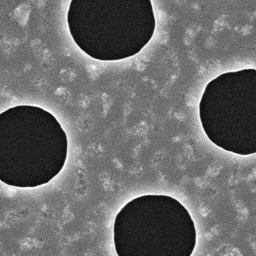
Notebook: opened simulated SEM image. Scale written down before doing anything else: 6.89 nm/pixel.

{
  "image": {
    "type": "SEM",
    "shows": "holes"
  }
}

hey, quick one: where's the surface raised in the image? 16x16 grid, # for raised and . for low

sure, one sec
####......######
####......######
#####....#######
######..########
##############..
#############...
############....
....#########...
....#########...
....##########..
....############
...#############
########...#####
#######.....####
#######.....####
#######.....####